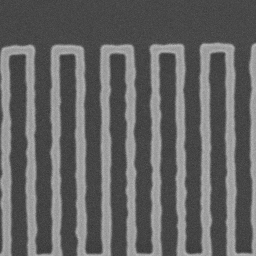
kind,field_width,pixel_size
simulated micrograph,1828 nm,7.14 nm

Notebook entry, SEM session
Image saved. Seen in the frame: groups of lines, slits or small figures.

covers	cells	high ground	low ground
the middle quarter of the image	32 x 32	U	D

DDDUUDDDDUUDDDDDUUDDDDUUDDDDUUDD
DDDUUDDDDUUDDDDDUUDDDDUUDDDDUUDD
DDDUUDDDDUUDDDDDUUDDDDUUDDDDUUDD
DDDUUDDDDUUDDDDDUUDDDDUUDDDDUUDD
DDDUUDDDDUUDDDDDUUDDDDUUDDDDUUDD
DDDUUDDDDUUDDDDDUUDDDDUUDDDDUUDD
DDDUUDDDDUUDDDDDUUDDDDUUDDDDUUDD
DDDUUDDDDUUDDDDDUUDDDDUUDDDDUUDD
DDDUUDDDDUUDDDDUUUDDDDUUDDDDUUDD
DDDUUDDDDUUDDDDDUUDDDDUUDDDDUUDD
DDDUUDDDDUUDDDDDUUDDDDUUDDDDUUDD
DDDUUDDDDUUDDDDDUUDDDDUUDDDDUUDD
DDDUUDDDDUUDDDDUUUDDDDUUDDDDUUDD
DDDUUDDDDDUDDDDDUUDDDDUUDDDDUUDD
DDDUUDDDDDUDDDDDUUDDDDUUDDDDUUDD
DDDUUDDDDUUDDDDDUUDDDDUUDDDDUUDD
DDDUUDDDDUUDDDDDUDDDDDUUDDDDUUDD
DDDUUDDDDUUDDDDDUDDDDDUUDDDDUUDD
DDDUUDDDDUUUDDDDUUDDDDUUDDDDUUDD
DDDUUDDDDUUUDDDDUUDDDDUUDDDDUUDD
DDDUUDDDDUUUDDDDUUDDDDUUDDDDUUDD
DDDUUDDDDUUUDDDDUUDDDDUUDDDDUUDD
DDDUUDDDDUUUDDDDUUDDDDUUDDDDUUDD
DDDUUDDDDUUUDDDDUUDDDDUUDDDDUUDD
DDDUUDDDDUUUDDDDUUDDDDUUDDDDUUDD
DDDUUDDDDUUUDDDDUUDDDDUUDDDDUUDD
DDDUUDDDDUUDDDDDUUDDDDUUDDDDUUDD
DDDUUDDDDUUDDDDDUUDDDDUUDDDDUUDD
DDDUUDDDDDUDDDDDUUDDDDUUDDDDUUDD
DDDUUDDDDDUDDDDDUUDDDDUUDDDDUUDD
DDDUUDDDDUUDDDDDUUDDDDUUDDDDUUDD
DDDUUDDDDUUDDDDDUUDDDDUUDDDDUUDD